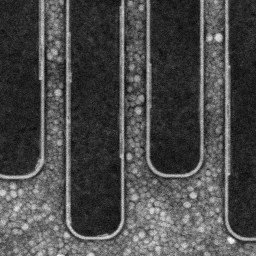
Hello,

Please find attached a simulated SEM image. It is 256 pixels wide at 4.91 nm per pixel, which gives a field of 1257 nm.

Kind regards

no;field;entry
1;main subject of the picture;one or a few lines or trenches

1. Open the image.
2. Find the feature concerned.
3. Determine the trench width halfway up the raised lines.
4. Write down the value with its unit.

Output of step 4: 120 nanometers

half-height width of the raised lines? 268 nm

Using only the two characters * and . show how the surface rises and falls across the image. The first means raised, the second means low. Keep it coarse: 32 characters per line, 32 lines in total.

*****...*******....******...****
*****...*******....******...****
*****...*******....******...****
*****...*******....******...****
*****...*******....******...****
*****...*******....******...****
*****...*******....******...****
*****...*******....******...****
*****...*******....******...****
*****...*******....******...****
*****....******....******...****
*****....******....******...****
*****....******....******...****
*****....******....******...****
*****...*******....******...****
*****...*******....******...****
*****....******....******...****
*****....******....******...****
*****....******....******...****
*****....******....******...****
*****....******....******...****
****....*******.....****....****
........*******.............****
........*******.............****
........*******.............****
........*******.............****
........*******.............****
.........******.............****
.........******..............***
..........****................**
................................
................................